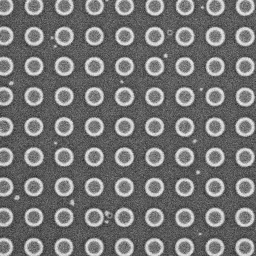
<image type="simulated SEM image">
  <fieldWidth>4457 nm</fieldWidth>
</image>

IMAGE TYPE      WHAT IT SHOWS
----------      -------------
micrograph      an array of small figures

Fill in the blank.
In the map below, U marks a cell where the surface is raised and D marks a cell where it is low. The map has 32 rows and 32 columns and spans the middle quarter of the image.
UUDDDUUUUUDDDUUUUDDDDUUUUDDDUUUU
UUDDDDUUUUDDDUUUUDDDDUUUUDDDUUUU
UDDDDDUUUDDDDDUUDDDDDUUUDDDDDUUU
DDDDDDDDDDDDDDDDDDDDDDDDDDDDDDDD
DDDDDDDDDDDDDDDDDDDDDDDDDDDDDDDD
DDDDDDDDDDDDDDDDDDDDDDDDDDDDDDDD
UUDDDDUUUDDDDDUUUDDDDUUUDDDDDUUU
UUDDDUUUUUDDDUUUUDDDDUUUUDDDUUUU
UUDDDUUUUUDDDUUUUDDDDUUUUDDDUUUU
UUDDDDUUUDDDDUUUUDDDDUUUDDDDUUUU
DDDDDDDDDDDDDDDDDDDDDDDDDDDDDDDD
DDDDDDDDDDDDDDDDDDDDDDDDDDDDDDDD
DDDDDDDDDDDDDDDDDDDDDDDDDDDDDDDD
UDDDDDDDDDDDDDDDDDDDDDDDDDDDDDDD
UUDDDDUUUUDDDUUUUDDDDUUUDDDDUUUU
UUDDDUUUUUDDDUUUUDDDUUUUUDDDUUUU
UUDDDUUUUUDDDUUUUDDDDUUUUDDDUUUU
UDDDDDUUUDDDDDUUUDDDDUUUDDDDDUUU
DDDDDDDDDDDDDDDDDDDDDDDDDDDDDDDD
DDDDDDDDDDDDDDDDDDDDDDDDDDDDDDDD
DDDDDDDDDDDDDDDDDDDDDDDDDDDDDDDD
UUDDDDUUUDDDDDUUUDDDDUUUDDDDDUUU
UUDDDUUUUUDDDUUUUDDDDUUUUDDDUUUU
UUDDDUUUUUDDDUUUUDDDUUUUUDDDUUUU
UUDDDDUUUDDDDUUUUDDDDUUUUDDDUUUU
UDDDDDDDDDDDDDDDDDDDDDDDDDDDDDDD
DDDDDDDDDDDDDDDDDDDDDDDDDDDDDDDD
DDDDDDDDDDDDDDDDDDDDDDDDDDDDDDDD
DDDDDDDDDDDDDDDDDDDDDDDDDDDDDDDD
UUDDDDUUUDDDDUUUUDDDDUUUUDDDUUUU
UUDDDUUUUUDDDUUUUDDDUUUUUDDDUUUU
UUDDDUUUUUDDDUUUUDDDUUUUUDDDUUUU